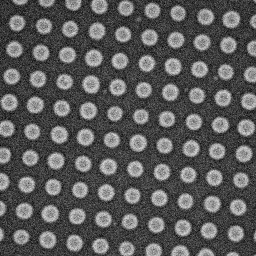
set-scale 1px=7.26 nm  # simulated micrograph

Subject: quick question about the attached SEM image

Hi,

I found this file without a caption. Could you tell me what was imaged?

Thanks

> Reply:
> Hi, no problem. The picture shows an array of small figures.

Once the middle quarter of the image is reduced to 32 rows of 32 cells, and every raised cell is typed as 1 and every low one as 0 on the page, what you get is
00000001000011100001111001111000
00000000000000000000110000111000
00000000000000000000000000110000
11000111000000000000000000000000
11000111100011100000000000000000
11000111100011100011110001110000
00000111000011100011110001110000
00000000000011100011100001110001
00000000000000000000000001110001
00000000000000000000000000000000
10001111000000000000000000000000
10001111000111000001000000000000
10001111000111000011100011100000
00000110000111000111100011110001
00000000000000000011000011100001
00000000000000000000000001100001
00001100000000000000000000000000
10001110000110000000000000000000
10011110001111000111000000000000
00001110001111000111100011100001
00000000000110000111000111100011
00000000000000000111000011100011
00000000000000000000000000000011
00001100000000000000000000000000
00011110011110000110000000000000
00011110011110001111000111000000
00001100011110001111000111000011
00000000001100001110000111000111
00000000000000000000000111000111
00000000000000000000000000000011
00111100011100000000000000000000
00111100011100001100000000000000